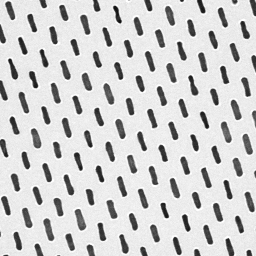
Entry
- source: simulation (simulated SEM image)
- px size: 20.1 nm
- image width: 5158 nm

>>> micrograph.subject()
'a regular array of holes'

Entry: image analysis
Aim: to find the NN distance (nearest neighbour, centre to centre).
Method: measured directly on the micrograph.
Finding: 491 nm